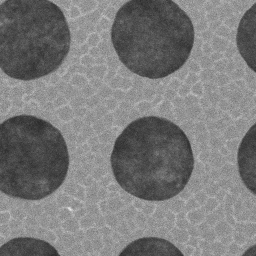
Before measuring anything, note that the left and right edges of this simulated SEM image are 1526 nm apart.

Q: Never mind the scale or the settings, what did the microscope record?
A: holes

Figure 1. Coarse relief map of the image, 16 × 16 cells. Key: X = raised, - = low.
----XXXX---XXXXX
----XXX-----XXX-
----XXX-----XXX-
----XXX-----XXX-
---XXXXX---XXXXX
XXXXXXXXXXXXXXXX
XXXXXXXXXXXXXXXX
---XXXXX--XXXXXX
----XXX-----XXX-
----XXX-----XXX-
----XXX-----XXX-
----XXX-----XXX-
XXXXXXXXX-XXXXXX
XXXXXXXXXXXXXXXX
XXXXXXXXXXXXXXXX
---XXXXX---XXXXX